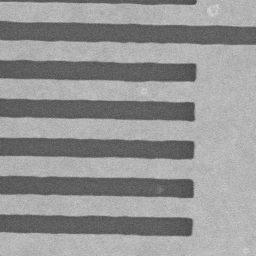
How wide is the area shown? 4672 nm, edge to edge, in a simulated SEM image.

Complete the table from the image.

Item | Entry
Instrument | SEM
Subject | groups of lines, slits or small figures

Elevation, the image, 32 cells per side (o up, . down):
oooooooooo.oo...........oooooooo
oooooooooooooooooooooooooooooooo
oooooooooooooooooooooooooooooooo
................................
................................
oooooooooooooooooooooooo........
oooooooooooooooooooooooooooooooo
....oooooooooooooooooooooooooooo
.........................ooooooo
........................oooooooo
oooooooooooooooooooooooooooooooo
oooooooooooooooooooooooooooooooo
...........ooooooooooooooooooooo
........................oooooooo
........................oooooooo
oooooooooooooooooooooooooooooooo
oooooooooooooooooooooooooooooooo
..................ooo.oooooooooo
........................oooooooo
........................oooooooo
oooooooooooooooooooooooooooooooo
oooooooooooooooooooooooooooooooo
........................oooooooo
........................oooooooo
oooooooo................oooooooo
oooooooooooooooooooooooooooooooo
oooooooooooooooooooooooooooooooo
........................oooooooo
........................oooooooo
oooooooooooooooooo.....ooooooooo
oooooooooooooooooooooooooooooooo
oooooooooooooooooooooooooooooooo